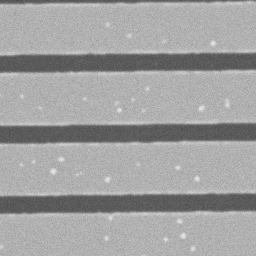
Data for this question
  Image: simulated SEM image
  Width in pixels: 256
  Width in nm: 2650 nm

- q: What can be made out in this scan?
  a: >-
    lines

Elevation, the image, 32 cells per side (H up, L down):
LLLLLLLLLLLLLLHHLHHHHHHHHHHHHHHH
HHHHHHHHHHHHHHHHHHHHHHHHHHHHHHHH
HHHHHHHHHHHHHHHHHHHHHHHHHHHHHHHH
HHHHHHHHHHHHHHHHHHHHHHHHHHHHHHHH
HHHHHHHHHHHHHHHHHHHHHHHHHHHHHHHH
HHHHHHHHHHHHHHHHHHHHHHHHHHHHHHHH
HHHHHHHHHHHHHHHHHHHHHHHHHLLLLLLL
LLLLLLLLLLLLLLLLLLLLLLLLLLLLLLLL
LLLLLLLLLLLLLLLLLLLLLLLLLLLLLLLL
HHHHHHHHHHHHHHHHHHHHHHHHHHHHHHHH
HHHHHHHHHHHHHHHHHHHHHHHHHHHHHHHH
HHHHHHHHHHHHHHHHHHHHHHHHHHHHHHHH
HHHHHHHHHHHHHHHHHHHHHHHHHHHHHHHH
HHHHHHHHHHHHHHHHHHHHHHHHHHHHHHHH
HHHHHHHHHHHHHHHHHHHHHHHHHHHHHHHH
HHHHHHHHHLLLLLLLLLLLLLLLLLLLLLLL
LLLLLLLLLLLLLLLLLLLLLLLLLLLLLLLL
LLLLLLLLLLLLLLLLLLLLLLLLLLLLLLLL
HHHHHHHHHHHHHHHHHHHHHHHHHHHHHHHH
HHHHHHHHHHHHHHHHHHHHHHHHHHHHHHHH
HHHHHHHHHHHHHHHHHHHHHHHHHHHHHHHH
HHHHHHHHHHHHHHHHHHHHHHHHHHHHHHHH
HHHHHHHHHHHHHHHHHHHHHHHHHHHHHHHH
HHHHHHHHHHHHHHHHHHHHHHHHHHHHHHHH
LLLLLLLLLLLLLLLLLLLLLLLLLLLLLLLL
LLLLLLLLLLLLLLLLLLLLLLLLLLLLLLLL
LLLLLLLLLLLLLLLLLLLLLLLLLLLLLLLL
HHHHHHHHHHHHHHHHHHHHHHHHHHHHHHHH
HHHHHHHHHHHHHHHHHHHHHHHHHHHHHHHH
HHHHHHHHHHHHHHHHHHHHHHHHHHHHHHHH
HHHHHHHHHHHHHHHHHHHHHHHHHHHHHHHH
HHHHHHHHHHHHHHHHHHHHHHHHHHHHHHHH